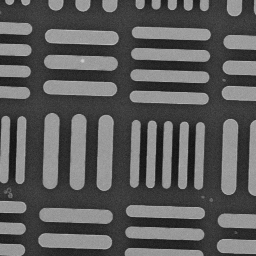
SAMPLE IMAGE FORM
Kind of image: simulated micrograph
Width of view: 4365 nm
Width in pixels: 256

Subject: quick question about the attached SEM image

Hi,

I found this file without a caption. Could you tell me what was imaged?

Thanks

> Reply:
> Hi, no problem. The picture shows groups of lines, slits or small figures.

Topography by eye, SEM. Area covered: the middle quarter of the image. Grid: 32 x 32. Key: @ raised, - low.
@@@@@@@@@@@@@-------------------
-----------------@@@@@@---------
-----------------@@@@@@@@@@@@@@@
-----------------@@@@@@@@@@@@@@@
@@@@----------------------------
@@@@@@@@@@@@@-------------------
@@@@@@@@@@@@@-------------------
@@@@@@@@@@@@@----@@@@@@@@@@@@@@@
-----------------@@@@@@@@@@@@@@@
---------------------@@@@@@@@@@@
--------------------------------
--------------------------------
--------------------------------
--@@@----@@@--------------------
--@@@@---@@@-----@@--@@---@-----
--@@@----@@@-----@@--@@--@@--@@-
--@@@----@@@-----@@--@@--@@--@@-
--@@@----@@@-----@@--@@--@@--@@-
--@@@----@@@-----@@--@@--@@--@@-
--@@@----@@@-----@@--@@--@@--@@-
--@@@----@@@-----@@--@@--@@--@@-
--@@@----@@@-----@@--@@--@@--@@-
--@@@---@@@@-----@@--@@--@@--@@-
--@@@---@@@@-----@@--@@--@@--@@-
--@@@---@@@@-----@@--@@--@@--@@-
--@@@---@@@@-----@@--@@--@@--@@-
--@@@---@@@@-----@@--@@--@@--@@-
--@@@---@@@@-----@@--@@--@@--@@-
--@@@---@@@@-----@@--@@--@@--@@-
--@@@---@@@@-----@@--@@--@@--@@-
--@@@---@@@@-----@---@---@@--@--
---------@@---------------------